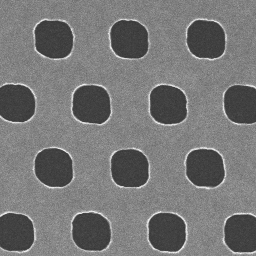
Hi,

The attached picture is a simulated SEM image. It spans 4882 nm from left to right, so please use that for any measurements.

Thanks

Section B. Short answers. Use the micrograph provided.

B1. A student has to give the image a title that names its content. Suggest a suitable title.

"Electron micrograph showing a regular array of holes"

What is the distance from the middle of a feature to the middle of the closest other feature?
1410 nanometers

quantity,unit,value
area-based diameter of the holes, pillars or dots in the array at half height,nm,757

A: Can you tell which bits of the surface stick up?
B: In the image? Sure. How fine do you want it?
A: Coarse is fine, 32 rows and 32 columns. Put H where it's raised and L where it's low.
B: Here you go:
HHHHHHHHHHHHHHHHHHHHHHHHHHHHHHHH
HHHHHHHHHHHHHHHHHHHHHHHHHHHHHHHH
HHHHHHHHHHHHHHHHHHHHHHHHHHHHHHHH
HHHHLLLLLHHHHHLLLLHHHHHHLLLLHHHH
HHHHLLLLLHHHHHLLLLHHHHHLLLLLHHHH
HHHHLLLLLHHHHHLLLLLHHHHLLLLLHHHH
HHHHHLLLLHHHHHLLLLHHHHHHLLLLHHHH
HHHHHHHHHHHHHHHHHHHHHHHHHHHHHHHH
HHHHHHHHHHHHHHHHHHHHHHHHHHHHHHHH
HHHHHHHHHHHHHHHHHHHHHHHHHHHHHHHH
HHHHHHHHHHHHHHHHHHHHHHHHHHHHHHHH
LLLLHHHHHLLLLHHHHHHLLLLHHHHHLLLL
LLLLHHHHHLLLLLHHHHHLLLLHHHHHLLLL
LLLLHHHHHLLLLLHHHHHLLLLHHHHHLLLL
LLLLHHHHHLLLLLHHHHHLLLLHHHHHLLLL
HHHHHHHHHHHHHHHHHHHHLLHHHHHHHHHH
HHHHHHHHHHHHHHHHHHHHHHHHHHHHHHHH
HHHHHHHHHHHHHHHHHHHHHHHHHHHHHHHH
HHHHHHHHHHHHHHHHHHHHHHHHHHHHHHHH
HHHHHLLLLHHHHHLLLLHHHHHLLLLLHHHH
HHHHLLLLLHHHHHLLLLLHHHHLLLLLHHHH
HHHHLLLLLHHHHHLLLLLHHHHLLLLLHHHH
HHHHHLLLLHHHHHLLLLHHHHHHLLLLHHHH
HHHHHHHHHHHHHHHHHHHHHHHHHHHHHHHH
HHHHHHHHHHHHHHHHHHHHHHHHHHHHHHHH
HHHHHHHHHHHHHHHHHHHHHHHHHHHHHHHH
HHHHHHHHHHHHHHHHHHHHHHHHHHHHHHHH
LLLLHHHHHLLLLHHHHHHLLLLHHHHHLLLL
LLLLHHHHHLLLLLHHHHHLLLLHHHHHLLLL
LLLLHHHHHLLLLLHHHHHLLLLHHHHHLLLL
LLLLHHHHHHLLLLHHHHHLLLLHHHHHLLLL
HHHHHHHHHHHHHHHHHHHHHHHHHHHHHHLH